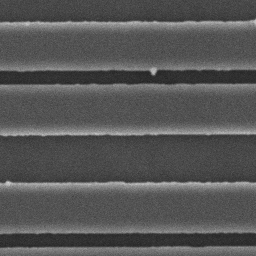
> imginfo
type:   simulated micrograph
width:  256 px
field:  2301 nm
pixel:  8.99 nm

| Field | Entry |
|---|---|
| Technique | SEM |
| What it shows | lines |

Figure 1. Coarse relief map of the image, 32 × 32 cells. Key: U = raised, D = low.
DDDDDDDDDDDDDDDDDDDDDDDDDDDDDDDD
DDDDDDDDDDDDDDDDDDDDDDDDDDDDDDDD
DDDDDDDDDDDDDDDDDDDDDDDDDDDDDDDD
UUUUUUUUUUUUUUUUUUUUUUUUUUUUUUUU
UUUUUUUUUUUUUUUUUUUUUUUUUUUUUUUU
UUUUUUUUUUUUUUUUUUUUUUUUUUUUUUUU
UUUUUUUUUUUUUUUUUUUUUUUUUUUUUUUU
UUUUUUUUUUUUUUUUUUUUUUUUUUUUUUUU
UUUUUUUUUUUUUUUUUUUUUUUUUUUUUUUU
DDDDDDDDDDDDDDDDDDDDDDDDDDDDDDDD
DDDDDDDDDDDDDDDDDDDDDDDDDDDDDDDD
UUUUUUUUUUUUUUUUUUUUUUUUUUUUUUUU
UUUUUUUUUUUUUUUUUUUUUUUUUUUUUUUU
UUUUUUUUUUUUUUUUUUUUUUUUUUUUUUUU
UUUUUUUUUUUUUUUUUUUUUUUUUUUUUUUU
UUUUUUUUUUUUUUUUUUUUUUUUUUUUUUUU
UUUUUUUUUUUUUUUUUUUUUUUUUUUUUUUU
DDDDDDDDDDDDDDDDDDDDDDDDDDDDDDDD
DDDDDDDDDDDDDDDDDDDDDDDDDDDDDDDD
DDDDDDDDDDDDDDDDDDDDDDDDDDDDDDDD
DDDDDDDDDDDDDDDDDDDDDDDDDDDDDDDD
DDDDDDDDDDDDDDDDDDDDDDDDDDDDDDDD
DDDDDDDDDDDDDDDDDDDDDDDDDDDDDDDD
UUUUUUUUUUUUUUUUUUUUUUUUUUUUUUUU
UUUUUUUUUUUUUUUUUUUUUUUUUUUUUUUU
UUUUUUUUUUUUUUUUUUUUUUUUUUUUUUUU
UUUUUUUUUUUUUUUUUUUUUUUUUUUUUUUU
UUUUUUUUUUUUUUUUUUUUUUUUUUUUUUUU
UUUUUUUUUUUUUUUUUUUUUUUUUUUUUUUU
DDDDDDDDDDDDDDDDDDDDDDDDDDDDDDDD
DDDDDDDDDDDDDDDDDDDDDDDDDDDDDDDD
UUUUUUUUUUUUUUUUUUUUUUUUUUUUUUUU